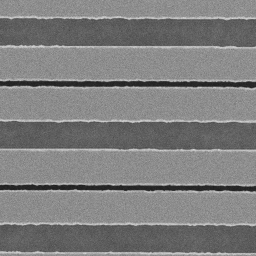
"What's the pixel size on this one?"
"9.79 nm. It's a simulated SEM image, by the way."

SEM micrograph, lines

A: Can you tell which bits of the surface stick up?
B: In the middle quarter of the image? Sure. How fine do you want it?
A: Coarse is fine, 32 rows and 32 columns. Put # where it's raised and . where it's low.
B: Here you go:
################################
################################
################################
################################
................................
................................
################################
################################
################################
################################
################################
################################
################################
################################
................................
................................
................................
................................
................................
................................
................................
##############..###.####.....#..
################################
################################
################################
################################
################################
################################
################################
################################
................................
.###.......#....................